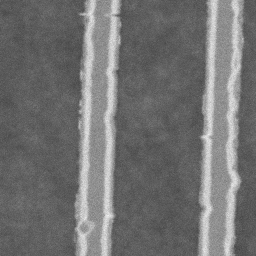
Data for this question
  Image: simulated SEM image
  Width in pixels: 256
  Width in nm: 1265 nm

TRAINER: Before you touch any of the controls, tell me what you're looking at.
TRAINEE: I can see one or a few lines or trenches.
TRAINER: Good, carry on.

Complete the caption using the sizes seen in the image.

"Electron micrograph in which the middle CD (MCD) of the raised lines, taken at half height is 0.117 µm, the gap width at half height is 490 nanometers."